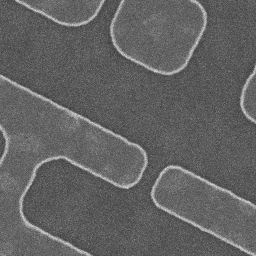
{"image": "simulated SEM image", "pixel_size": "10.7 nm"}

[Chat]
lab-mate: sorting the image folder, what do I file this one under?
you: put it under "one or a few lines or trenches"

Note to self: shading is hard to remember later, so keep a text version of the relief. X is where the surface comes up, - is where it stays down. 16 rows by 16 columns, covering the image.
--XXXX-XXXXXX---
----X--XXXXXX---
-------XXXXX----
--------XXXX----
----------X-----
X--------------X
XXX------------X
XXXXX-----------
XXXXXXX---------
XXXXXXXXX-------
XX---XXXX-------
XX-----X--XXX---
X---------XXXXX-
X----------XXXXX
XXX----------XXX
XXXXX----------X